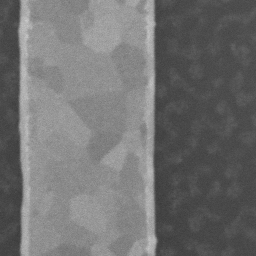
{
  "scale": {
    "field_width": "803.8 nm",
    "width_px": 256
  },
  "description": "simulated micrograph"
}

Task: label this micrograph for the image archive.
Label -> one or a few lines or trenches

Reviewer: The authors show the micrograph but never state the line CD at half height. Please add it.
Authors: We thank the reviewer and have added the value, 401 nanometres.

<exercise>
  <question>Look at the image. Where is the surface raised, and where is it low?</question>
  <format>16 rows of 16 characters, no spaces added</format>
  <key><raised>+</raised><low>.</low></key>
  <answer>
.++++++++.......
.++++++++.......
.++++++++.......
.++++++++.......
.++++++++.......
.++++++++.......
.++++++++.......
.++++++++.......
.++++++++.......
.++++++++.......
..+++++++.......
..+++++++.......
..+++++++.......
..+++++++.......
..++++++++......
..++++++++......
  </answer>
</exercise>